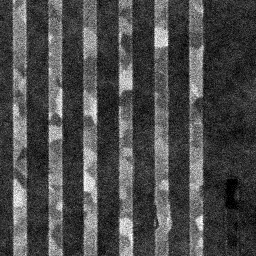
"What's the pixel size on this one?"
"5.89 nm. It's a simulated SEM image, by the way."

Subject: parallel lines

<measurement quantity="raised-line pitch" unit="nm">208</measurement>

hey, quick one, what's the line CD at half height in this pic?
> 75.1 nanometers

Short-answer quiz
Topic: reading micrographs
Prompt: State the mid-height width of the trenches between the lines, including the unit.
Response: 135 nm